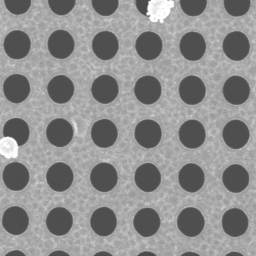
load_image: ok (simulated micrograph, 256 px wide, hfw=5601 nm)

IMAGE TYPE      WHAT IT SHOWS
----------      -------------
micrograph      a regular array of holes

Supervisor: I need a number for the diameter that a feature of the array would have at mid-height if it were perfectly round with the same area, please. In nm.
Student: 613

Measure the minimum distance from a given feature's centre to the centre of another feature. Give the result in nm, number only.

956